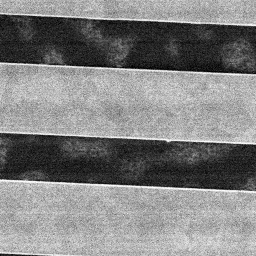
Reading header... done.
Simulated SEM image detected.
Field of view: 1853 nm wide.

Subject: one or a few lines or trenches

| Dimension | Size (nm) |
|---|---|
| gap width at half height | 350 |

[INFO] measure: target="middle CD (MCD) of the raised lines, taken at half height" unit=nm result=496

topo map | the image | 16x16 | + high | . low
++++++++++++++++
.............+++
................
................
++++++++++++....
++++++++++++++++
++++++++++++++++
++++++++++++++++
......++++++++++
................
................
+++++...........
++++++++++++++++
++++++++++++++++
++++++++++++++++
++++++++++++++++